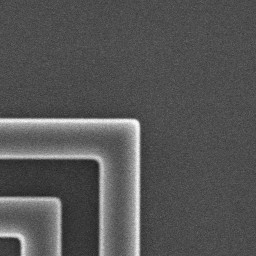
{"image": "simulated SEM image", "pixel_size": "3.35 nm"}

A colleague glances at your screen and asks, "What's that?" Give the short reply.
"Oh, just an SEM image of groups of lines, slits or small figures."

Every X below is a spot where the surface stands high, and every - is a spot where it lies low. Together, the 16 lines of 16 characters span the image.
----------------
----------------
----------------
----------------
----------------
----------------
----------------
----------------
XXXXXXXXX-------
XXXXXXXXX-------
------XXX-------
------XXX-------
XXX---XXX-------
XXXX--XXX-------
XXXX--XXX-------
-XXX--XXX-------